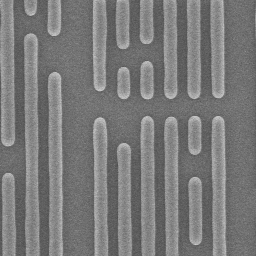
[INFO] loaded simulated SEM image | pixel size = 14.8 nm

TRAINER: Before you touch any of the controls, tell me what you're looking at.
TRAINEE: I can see groups of lines, slits or small figures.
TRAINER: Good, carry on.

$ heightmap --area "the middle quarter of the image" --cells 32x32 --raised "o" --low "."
.......ooo.........ooo...ooo...o
.......ooo....oo...ooo...ooo...o
.......ooo...ooo...ooo...ooo...o
.......ooo...ooo...ooo...ooo...o
.......ooo...ooo...ooo...ooo...o
.......ooo...ooo...ooo...ooo...o
........oo...ooo...ooo...ooo...o
.............ooo...ooo...ooo...o
..............oo....oo....o.....
................................
................................
................................
................................
....................oo....o.....
........oo.........ooo...ooo...o
.......ooo.........ooo...ooo...o
.......oooo........ooo...ooo...o
.......oooo........ooo...ooo...o
.......oooo........ooo...ooo...o
.......oooo........ooo...ooo...o
.......oooo...oo...ooo...ooo...o
.......oooo..oooo..ooo...ooo...o
........ooo..oooo..ooo...ooo....
........ooo..oooo..ooo...ooo....
........ooo..oooo..ooo...ooo....
........ooo...ooo..ooo...ooo....
........ooo...ooo..ooo...ooo....
........ooo...ooo..ooo...ooo....
........ooo...ooo..ooo...ooo....
........ooo...ooo..ooo...ooo...o
........ooo...ooo..ooo...ooo...o
........ooo...ooo..ooo...ooo...o